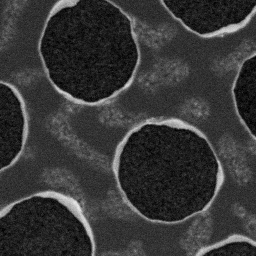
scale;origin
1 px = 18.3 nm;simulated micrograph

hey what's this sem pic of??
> holes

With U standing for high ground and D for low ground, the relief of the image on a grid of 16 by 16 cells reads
UUUUDDDUUUDDDDDD
UUUDDDDDUUUUDDDU
UUUDDDDDUUUUUUUU
UUUDDDDDDUUUUUUU
UUUDDDDDUUUUUUUD
DUUUDDDDUUUUUUUD
DUUUUUUUUUUUUUUD
DDUUUUUUUUUUUUUD
DDUUUUUUDDDDDUUU
DUUUUUUDDDDDDUUU
UUUUUUUDDDDDDDUU
UUUUUUUUDDDDDDUU
UUDDUUUUDDDDDUUU
DDDDDUUUUDDDUUUU
DDDDDUUUUUUUUUUU
DDDDDDUUUUUUUDDD